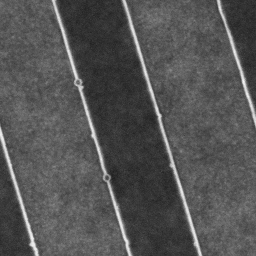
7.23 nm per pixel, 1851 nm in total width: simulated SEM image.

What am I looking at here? one or a few lines or trenches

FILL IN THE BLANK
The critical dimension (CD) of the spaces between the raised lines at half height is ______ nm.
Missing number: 645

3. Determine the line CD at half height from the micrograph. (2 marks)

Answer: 486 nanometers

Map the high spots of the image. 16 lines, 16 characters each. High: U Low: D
DDDUUUUUDDDDDDUU
DDDDUUUUDDDDDDUU
DDDDUUUUDDDDDDUU
DDDDUUUUUDDDDDDU
DDDDDUUUUDDDDDDU
DDDDDUUUUDDDDDDU
DDDDDUUUUUDDDDDD
DDDDDDUUUUDDDDDD
DDDDDDUUUUDDDDDD
DDDDDDUUUUUDDDDD
UDDDDDUUUUUDDDDD
UDDDDDDUUUUDDDDD
UDDDDDDUUUUDDDDD
UUDDDDDUUUUUDDDD
UUDDDDDDUUUUDDDD
UUDDDDDDUUUUDDDD